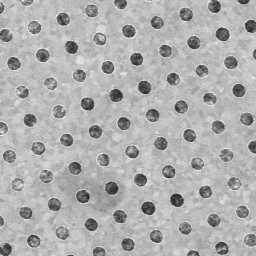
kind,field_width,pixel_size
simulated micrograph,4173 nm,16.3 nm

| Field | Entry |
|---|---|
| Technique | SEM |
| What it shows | a regular array of holes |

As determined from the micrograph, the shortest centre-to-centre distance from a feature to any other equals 477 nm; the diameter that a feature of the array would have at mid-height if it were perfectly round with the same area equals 226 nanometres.